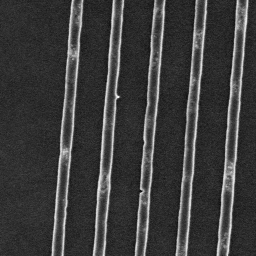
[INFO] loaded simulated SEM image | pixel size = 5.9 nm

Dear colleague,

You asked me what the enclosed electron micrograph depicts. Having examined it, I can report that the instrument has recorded parallel lines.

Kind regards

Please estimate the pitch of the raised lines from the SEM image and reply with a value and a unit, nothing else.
243 nanometres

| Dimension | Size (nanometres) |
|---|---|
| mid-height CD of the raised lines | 64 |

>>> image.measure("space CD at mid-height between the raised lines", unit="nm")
183